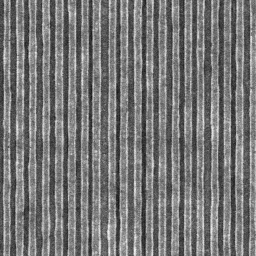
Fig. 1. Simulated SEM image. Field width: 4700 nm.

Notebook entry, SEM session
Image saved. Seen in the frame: parallel lines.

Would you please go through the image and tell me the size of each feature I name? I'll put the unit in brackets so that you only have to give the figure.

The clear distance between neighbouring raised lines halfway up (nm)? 126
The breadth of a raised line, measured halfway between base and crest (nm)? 108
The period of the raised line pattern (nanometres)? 237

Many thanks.